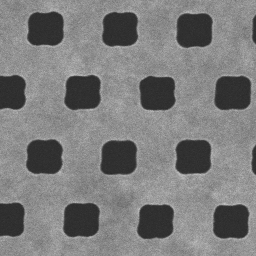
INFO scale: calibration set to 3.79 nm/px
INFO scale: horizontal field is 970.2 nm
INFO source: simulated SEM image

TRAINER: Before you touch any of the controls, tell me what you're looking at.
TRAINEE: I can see a regular array of holes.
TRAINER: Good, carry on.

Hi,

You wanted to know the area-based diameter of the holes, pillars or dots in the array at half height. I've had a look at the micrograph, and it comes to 142 nm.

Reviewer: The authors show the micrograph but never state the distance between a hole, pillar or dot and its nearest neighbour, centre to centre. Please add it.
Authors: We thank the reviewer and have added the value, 278 nanometers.